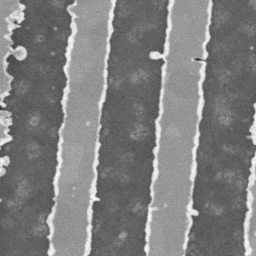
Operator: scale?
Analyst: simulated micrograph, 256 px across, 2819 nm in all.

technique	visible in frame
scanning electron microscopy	one or a few lines or trenches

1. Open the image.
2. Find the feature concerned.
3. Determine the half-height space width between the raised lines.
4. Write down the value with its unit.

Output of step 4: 0.63 micrometres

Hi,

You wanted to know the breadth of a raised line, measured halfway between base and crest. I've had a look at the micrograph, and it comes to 427 nanometers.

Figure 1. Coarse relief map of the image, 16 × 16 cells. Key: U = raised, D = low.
UDDDUUUDDDDUUDDD
UDDDDUUDDDDUUDDD
UDDDUUUDDDUUUDDD
UDDDUUUDDDUUUDDD
UDDDUUUDDDUUUDDD
UDDDUUUDDDUUUDDD
DDDDUUDDDDUUUDDD
DDDDUUDDDDUUDDDD
UDDDUUDDDDUUDDDD
DDDDUUDDDDUUDDDD
DDDDUUDDDDUUDDDD
DDDUUUDDDDUUDDDD
DDDUUUDDDUUUDDDD
DDDUUUDDDUUUDDDD
DDDUUUDDDUUUDDDU
DDDUUDDDDUUUDDDU